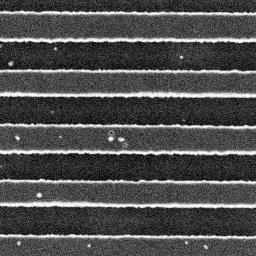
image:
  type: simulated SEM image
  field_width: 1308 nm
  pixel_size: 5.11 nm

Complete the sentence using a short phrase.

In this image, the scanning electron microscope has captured lines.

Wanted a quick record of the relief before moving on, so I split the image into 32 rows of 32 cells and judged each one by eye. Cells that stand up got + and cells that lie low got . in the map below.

................................
..+.............................
++++++++++++++++++++++++++++++++
++++++++++++++++++++++++++++++++
++++++++++++++++++++++++++++++++
................................
................................
................................
................................
++++++++++++++++++++++++++++++++
++++++++++++++++++++++++++++++++
++++++++++++++++++++++++++++++++
................................
................................
................................
................................
++++++++++++++++++++++++++++++++
++++++++++++++++++++++++++++++++
++++++++++++++++++++++++++++++++
................................
................................
................................
.+...+..........................
++++++++++++++++++++++++++++++++
++++++++++++++++++++++++++++++++
++++++++++++++++++++++++++++++++
................................
................................
................................
++++.+++++......................
++++++++++++++++++++++++++++++++
++++++++++++++++++++++++++++++++